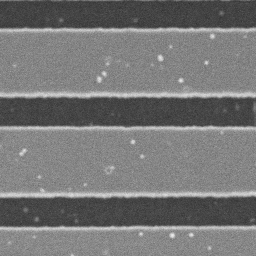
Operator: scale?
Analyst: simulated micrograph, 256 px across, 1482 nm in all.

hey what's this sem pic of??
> lines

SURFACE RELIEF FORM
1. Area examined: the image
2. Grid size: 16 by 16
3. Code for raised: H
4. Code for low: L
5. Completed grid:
LLLLLLLLLLLLLLLL
LLLLLLLLLLLLLLLL
HHHHHHHHHHHHHHHH
HHHHHHHHHHHHHHHH
HHHHHHHHHHHHHHHH
HHHHHHHHHHHHHHHH
LLLLLLLLLLLLLLLL
LLLLLLLLLLLLLLLL
HHHHHHHHHHHHHHHH
HHHHHHHHHHHHHHHH
HHHHHHHHHHHHHHHH
HHHHHHHHHHHHHHHH
LLLLLLLLLLLLLLLL
LLLLLLLLLLLLLLLL
HHHHHHHHHHHHHHHH
HHHHHHHHHHHHHHHH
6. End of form